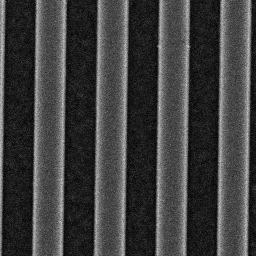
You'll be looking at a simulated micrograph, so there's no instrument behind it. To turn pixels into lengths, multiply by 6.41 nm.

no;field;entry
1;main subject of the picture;parallel lines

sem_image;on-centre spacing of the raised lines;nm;395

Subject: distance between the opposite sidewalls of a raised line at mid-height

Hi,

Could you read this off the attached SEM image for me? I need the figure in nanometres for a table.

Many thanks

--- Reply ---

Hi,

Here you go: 187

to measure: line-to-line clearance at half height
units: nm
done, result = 211